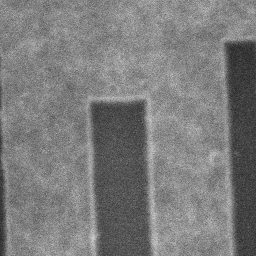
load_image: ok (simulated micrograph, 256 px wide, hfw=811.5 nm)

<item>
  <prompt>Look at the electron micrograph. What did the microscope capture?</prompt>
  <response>one or a few lines or trenches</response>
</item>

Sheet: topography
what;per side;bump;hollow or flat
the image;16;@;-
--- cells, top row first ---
@@@@@@@@@@@@@@@@
@@@@@@@@@@@@@@@@
@@@@@@@@@@@@@@@-
@@@@@@@@@@@@@@--
@@@@@@@@@@@@@@--
@@@@@@@@@@@@@@--
@@@@@@---@@@@@--
@@@@@@---@@@@@--
@@@@@@---@@@@@--
@@@@@@---@@@@@--
@@@@@@---@@@@@--
@@@@@@---@@@@@--
@@@@@@---@@@@@--
@@@@@@----@@@@--
@@@@@@----@@@@--
@@@@@@----@@@@@-